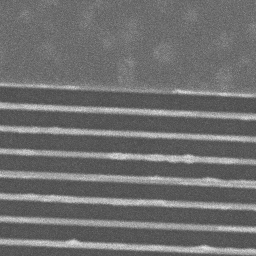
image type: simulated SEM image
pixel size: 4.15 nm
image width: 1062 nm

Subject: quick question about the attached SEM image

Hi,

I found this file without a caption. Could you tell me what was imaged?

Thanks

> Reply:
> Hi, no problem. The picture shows parallel lines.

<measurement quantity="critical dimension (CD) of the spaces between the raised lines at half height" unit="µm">0.071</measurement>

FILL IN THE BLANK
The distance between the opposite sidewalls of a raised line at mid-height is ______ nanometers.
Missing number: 21.2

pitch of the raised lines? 93.6 nanometers